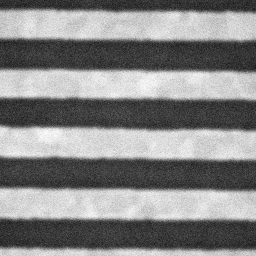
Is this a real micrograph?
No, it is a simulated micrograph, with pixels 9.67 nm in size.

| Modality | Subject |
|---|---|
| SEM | lines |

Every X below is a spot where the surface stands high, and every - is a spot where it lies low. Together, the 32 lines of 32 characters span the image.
--------------------------------
XXXXXXXXXXXXXX------------------
XXXXXXXXXXXXXXXXXXXXXXXXXXXXXXXX
XXXXXXXXXXXXXXXXXXXXXXXXXXXXXXXX
XXXXXXXXXXXXXXXXXXXXXXXXXXXXXXXX
--------------------------------
--------------------------------
--------------------------------
--------------------------------
XXXXXXXXXXXXXXXXXXXXXXXXXXXXXXXX
XXXXXXXXXXXXXXXXXXXXXXXXXXXXXXXX
XXXXXXXXXXXXXXXXXXXXXXXXXXXXXXXX
--------------------------------
--------------------------------
--------------------------------
--------------------------------
XXXXXXXXXXXXXXXXXXXXXXXXXXXXXX--
XXXXXXXXXXXXXXXXXXXXXXXXXXXXXXXX
XXXXXXXXXXXXXXXXXXXXXXXXXXXXXXXX
XXXXXXXXXXXXXXXXXXXXXXXXXXXXXXXX
--------------------------------
--------------------------------
--------------------------------
--------------------------------
XXXXXXXXXXXXXXXXXXXXXXXXXXXXXXXX
XXXXXXXXXXXXXXXXXXXXXXXXXXXXXXXX
XXXXXXXXXXXXXXXXXXXXXXXXXXXXXXXX
--------------------------------
--------------------------------
--------------------------------
--------------------------------
XXXXXXXXXXXXXXXXXXXXXXXXXXXXXXXX